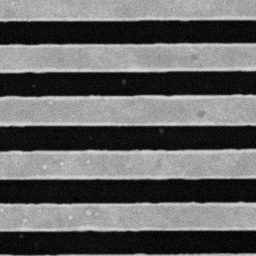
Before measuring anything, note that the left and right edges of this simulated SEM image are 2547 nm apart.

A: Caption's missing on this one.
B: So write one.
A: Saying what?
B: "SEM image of lines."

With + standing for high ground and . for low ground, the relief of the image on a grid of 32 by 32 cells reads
++++++++++++++++++++++++++++++++
++++++++++++++++++++++++++++++++
++++++++++++++++................
................................
................................
...................++.++.+++++++
++++++++++++++++++++++++++++++++
++++++++++++++++++++++++++++++++
++++++++++++++++++++++++++++++++
................................
................................
................................
++++++++++++++++++++++++++++++++
++++++++++++++++++++++++++++++++
++++++++++++++++++++++++++++++++
++++++++++++++++++++++++++++++++
................................
................................
................................
++++++++++++++++++++++++++++++++
++++++++++++++++++++++++++++++++
++++++++++++++++++++++++++++++++
................................
................................
................................
..................++++++++++.+++
++++++++++++++++++++++++++++++++
++++++++++++++++++++++++++++++++
++++++++++++++++++++++++++++++++
................................
................................
................................